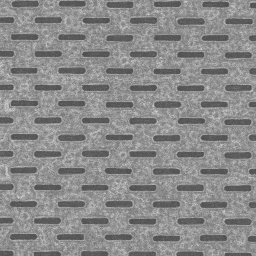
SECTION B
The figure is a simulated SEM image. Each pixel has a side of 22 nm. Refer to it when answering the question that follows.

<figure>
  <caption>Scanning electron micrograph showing a regular array of holes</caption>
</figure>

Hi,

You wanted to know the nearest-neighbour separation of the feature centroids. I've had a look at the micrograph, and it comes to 623 nm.